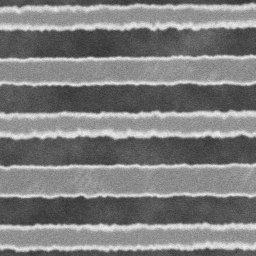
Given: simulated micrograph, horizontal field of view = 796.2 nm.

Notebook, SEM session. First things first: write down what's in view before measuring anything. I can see lines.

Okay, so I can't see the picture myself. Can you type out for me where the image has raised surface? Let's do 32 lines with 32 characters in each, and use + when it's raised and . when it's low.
................................
++++++++++++++++++++++++++++++++
++++++++++++++++++++++++++++++++
++++++++++++..++...++.+.+.......
................................
................................
................................
++++++++++++++++++++++++++++++++
++++++++++++++++++++++++++++++++
++++++++++++++++++++++++++++++++
++++++++++++++++++++++..++++.+++
................................
................................
................................
++++++++++++++++++++++++++++++++
++++++++++++++++++++++++++++++++
++++++++++++++++++++++++++++++++
................................
................................
................................
................................
++++++++++++++++++++++++++++++++
++++++++++++++++++++++++++++++++
++++++++++++++++++++++++++++++++
++++++++++++..++++.++......+...+
................................
................................
................................
++++++++++++++++++++++++++++++++
++++++++++++++++++++++++++++++++
++++++++++++++++++++++++++++++++
................................